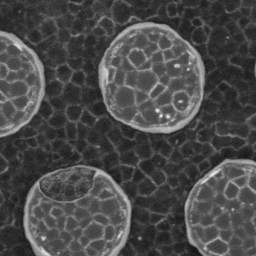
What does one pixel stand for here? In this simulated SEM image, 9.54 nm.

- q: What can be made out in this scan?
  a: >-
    raised bodies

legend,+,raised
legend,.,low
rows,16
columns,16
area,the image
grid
................
.........+......
+......+++++....
++.....+++++....
+++...+++++++...
+++...+++++++...
++.....+++++....
++.....+++++....
................
................
....++.......+++
..+++++.....++++
..++++++....++++
..++++++....++++
..++++++....++++
..+++++.....++++